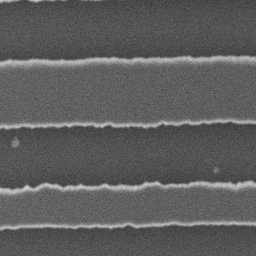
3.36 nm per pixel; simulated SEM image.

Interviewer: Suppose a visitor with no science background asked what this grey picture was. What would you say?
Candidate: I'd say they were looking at lines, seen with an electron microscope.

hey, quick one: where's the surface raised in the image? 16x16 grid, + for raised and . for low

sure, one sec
................
................
................
................
++++++++++++++++
++++++++++++++++
++++++++++++++++
++++++++++++++++
................
................
................
.........+..++.+
++++++++++++++++
++++++++++++++++
................
................